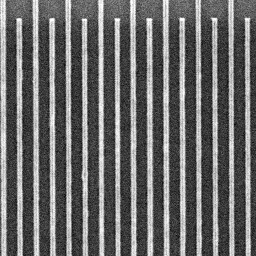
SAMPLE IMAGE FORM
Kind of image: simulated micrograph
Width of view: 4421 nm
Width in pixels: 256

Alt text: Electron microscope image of parallel lines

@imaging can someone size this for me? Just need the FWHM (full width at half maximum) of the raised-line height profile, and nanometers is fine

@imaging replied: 60.5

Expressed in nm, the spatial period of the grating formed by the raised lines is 281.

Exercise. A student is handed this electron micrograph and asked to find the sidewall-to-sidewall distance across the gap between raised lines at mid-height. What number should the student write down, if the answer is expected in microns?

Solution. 0.209